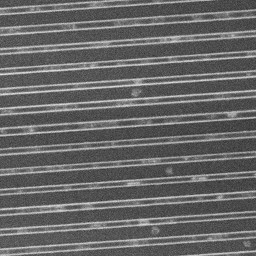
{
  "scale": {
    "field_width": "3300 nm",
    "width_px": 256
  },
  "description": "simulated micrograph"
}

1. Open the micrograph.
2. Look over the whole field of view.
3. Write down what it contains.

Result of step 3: parallel lines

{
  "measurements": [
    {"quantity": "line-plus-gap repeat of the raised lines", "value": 0.258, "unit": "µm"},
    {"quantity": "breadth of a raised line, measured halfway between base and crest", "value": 80.4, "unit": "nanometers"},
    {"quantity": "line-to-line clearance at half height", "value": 172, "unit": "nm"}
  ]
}